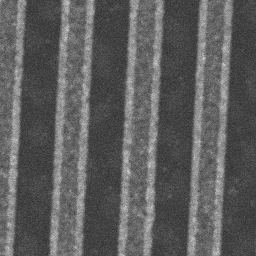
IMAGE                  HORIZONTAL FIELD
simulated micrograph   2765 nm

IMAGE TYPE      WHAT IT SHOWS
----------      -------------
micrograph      one or a few lines or trenches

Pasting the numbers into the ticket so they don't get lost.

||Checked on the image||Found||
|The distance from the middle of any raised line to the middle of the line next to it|745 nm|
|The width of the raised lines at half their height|0.283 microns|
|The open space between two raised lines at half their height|462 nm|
